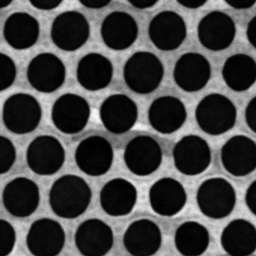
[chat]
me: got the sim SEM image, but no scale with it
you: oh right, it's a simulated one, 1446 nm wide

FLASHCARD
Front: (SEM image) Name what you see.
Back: a regular array of holes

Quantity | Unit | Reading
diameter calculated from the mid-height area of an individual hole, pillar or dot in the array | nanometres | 218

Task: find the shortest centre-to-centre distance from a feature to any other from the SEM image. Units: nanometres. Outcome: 269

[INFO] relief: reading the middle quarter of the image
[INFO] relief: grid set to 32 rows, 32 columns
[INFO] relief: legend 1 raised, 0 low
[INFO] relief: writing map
11100000000011100000000001110000
11100000000011100000000001100000
11100000000011100000000001100000
11100000000011100000000001110000
11110000000011100000000011110000
11111000001111110000000111111000
11111100111111111000000111111100
00111111111111111111111111111111
00000111111000001111111100001111
00000011110000000111110000000111
00000011100000000011110000000011
00000001100000000011100000000011
00000011100000000011100000000001
00000011100000000011100000000011
00000011110000000011100000000011
00000111110000000111110000000111
00001111111000001111111000001111
11111111111111111111111111111111
11111100001111111000001111111100
11110000000111110000000111110000
11100000000011110000000011110000
11100000000011100000000011110000
11100000000011100000000011100000
11100000000011100000000001100000
11100000000011100000000011110000
11110000000011110000000011110000
11110000000111110000000111111000
11111100001111111100001111111100
00001111111111111111111110011111
00000111111000001111111000000111
00000011110000000111110000000111
00000001100000000011110000000011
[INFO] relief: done